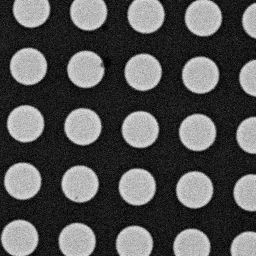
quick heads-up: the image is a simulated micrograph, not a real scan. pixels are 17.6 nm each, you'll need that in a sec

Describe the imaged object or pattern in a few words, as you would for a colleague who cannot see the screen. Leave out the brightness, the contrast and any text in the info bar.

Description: an array of small figures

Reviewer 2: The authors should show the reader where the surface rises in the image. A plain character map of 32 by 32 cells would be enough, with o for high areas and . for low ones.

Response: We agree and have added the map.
..oooo...oooo...oooo....ooo.....
..oooo...oooo...oooo...ooooo...o
..oooo...oooo...oooo...ooooo..oo
..........oo.....ooo....ooo....o
...............................o
................................
..ooo.....o.....................
.ooooo...oooo...oooo....oo......
.ooooo..ooooo...oooo...oooo...oo
..ooo....oooo...oooo...oooo...oo
...o.....ooo....oooo...oooo...oo
........................oo.....o
................................
..oo............................
.oooo....ooo....ooo.....oo......
.oooo...ooooo..ooooo...oooo...oo
.oooo...ooooo..ooooo..ooooo...oo
..oo.....ooo....ooo....oooo...oo
........................oo....oo
................................
..oo............................
.oooo...oooo....oo..............
.oooo...oooo...oooo...oooo....oo
.oooo...oooo...oooo...ooooo..ooo
..oo....oooo...oooo...oooo...ooo
................oo.....ooo....oo
................................
................................
.ooo....ooo.....oo..............
ooooo..ooooo...oooo...oooo....oo
ooooo..ooooo...oooo...oooo...ooo
.ooo....ooo....oooo...oooo...ooo